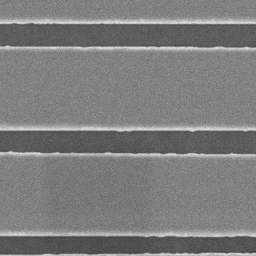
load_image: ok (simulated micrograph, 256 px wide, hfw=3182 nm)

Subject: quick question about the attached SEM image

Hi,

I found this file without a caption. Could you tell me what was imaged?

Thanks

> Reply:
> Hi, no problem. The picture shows lines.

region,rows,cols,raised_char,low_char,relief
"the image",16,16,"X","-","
XXXXXXXXXXXXXXXX
----------------
----------------
XXXXXXXXXXXXXXXX
XXXXXXXXXXXXXXXX
XXXXXXXXXXXXXXXX
XXXXXXXXXXXXXXXX
XXXXXXXXXXXXXXXX
----------------
X---------------
XXXXXXXXXXXXXXXX
XXXXXXXXXXXXXXXX
XXXXXXXXXXXXXXXX
XXXXXXXXXXXXXXXX
XXXXXXXXXXXXXXXX
----------------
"